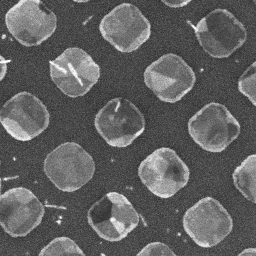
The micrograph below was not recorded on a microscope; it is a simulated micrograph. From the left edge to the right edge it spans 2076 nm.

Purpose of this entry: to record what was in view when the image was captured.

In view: a regular array of raised bodies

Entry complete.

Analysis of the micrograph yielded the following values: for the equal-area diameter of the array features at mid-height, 0.382 micrometres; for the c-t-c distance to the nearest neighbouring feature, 539 nm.